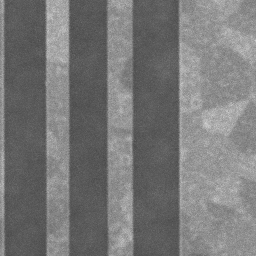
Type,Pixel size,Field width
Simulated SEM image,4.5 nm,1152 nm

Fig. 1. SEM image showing one or a few lines or trenches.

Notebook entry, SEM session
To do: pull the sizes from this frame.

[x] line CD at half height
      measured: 102 nanometres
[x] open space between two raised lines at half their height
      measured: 196 nanometres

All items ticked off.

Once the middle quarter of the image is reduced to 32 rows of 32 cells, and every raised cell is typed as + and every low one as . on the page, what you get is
+..........++++++............+++
+..........++++++............+++
+..........++++++............+++
+..........++++++............+++
+..........++++++............+++
+..........++++++............+++
+..........++++++............+++
+..........++++++............+++
+..........++++++............+++
+..........++++++............+++
+..........++++++............+++
+..........++++++............+++
+..........++++++............+++
+..........++++++............+++
+..........++++++............+++
+..........++++++............+++
+..........++++++............+++
+..........++++++............+++
+..........++++++............+++
+..........++++++............+++
+..........++++++............+++
+..........++++++............+++
+..........++++++............+++
+..........++++++............+++
+..........++++++............+++
+..........++++++............+++
+..........++++++............+++
+..........++++++............+++
+..........++++++............+++
+..........++++++............+++
+..........++++++............+++
+..........++++++............+++